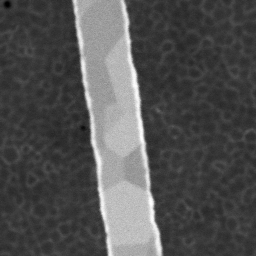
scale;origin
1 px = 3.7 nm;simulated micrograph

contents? one or a few lines or trenches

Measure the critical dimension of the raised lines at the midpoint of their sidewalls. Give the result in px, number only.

48.4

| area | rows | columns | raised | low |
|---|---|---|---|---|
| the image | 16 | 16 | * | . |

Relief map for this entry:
.....***........
.....***........
.....***........
.....***........
.....***........
.....****.......
......***.......
......***.......
......***.......
......***.......
......***.......
......***.......
......***.......
......****......
.......***......
.......***......